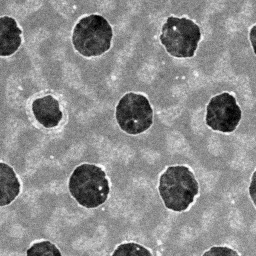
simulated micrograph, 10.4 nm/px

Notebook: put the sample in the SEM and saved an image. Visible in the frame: holes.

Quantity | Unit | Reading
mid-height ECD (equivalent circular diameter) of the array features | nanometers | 427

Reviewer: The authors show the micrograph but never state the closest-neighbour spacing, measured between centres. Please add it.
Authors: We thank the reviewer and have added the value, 0.896 um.